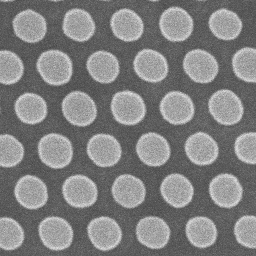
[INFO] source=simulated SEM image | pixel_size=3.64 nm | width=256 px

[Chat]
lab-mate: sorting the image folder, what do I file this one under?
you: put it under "a regular array of raised bodies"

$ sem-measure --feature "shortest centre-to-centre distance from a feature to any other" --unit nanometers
174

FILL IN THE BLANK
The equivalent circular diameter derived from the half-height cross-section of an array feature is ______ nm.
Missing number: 117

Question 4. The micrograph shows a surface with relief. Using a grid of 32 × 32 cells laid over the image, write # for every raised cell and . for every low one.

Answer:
................................
...#.....##....##....##....##...
..###...###...####..####..####..
..####..####..####..####..####..
..###....##....##....##....###..
................................
......#.....#.....#.....##....##
##...####..###...####..####..###
###..####..####..####..####..###
###..####..####..####...###...##
................................
...........................##...
..###...###...####..####..####..
..####..####..####..####..####..
..####..####..####..####...###..
.........##.................#...
................................
##...###...###....###...###...##
###..####..####..####..####...##
###..####..####..####...###...##
##....##....##....##............
................................
...##...###....##....##....##...
..####..####..####..####..####..
..####..####..####..####..####..
...##....##....##....##....##...
................................
##....##....##....##....##....##
###..####..####..####..####..###
###..####..####..####...###...##
##....###...###...###...##.....#
................................